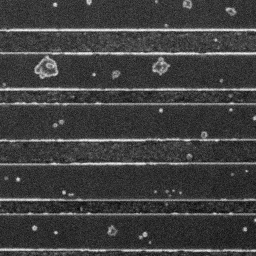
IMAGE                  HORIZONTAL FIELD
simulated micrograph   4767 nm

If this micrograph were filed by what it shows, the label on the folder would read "lines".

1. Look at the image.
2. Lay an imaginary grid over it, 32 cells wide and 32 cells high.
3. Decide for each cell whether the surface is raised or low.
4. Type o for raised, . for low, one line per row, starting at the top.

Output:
oooooooooooooooooooooooooooooooo
oooooooooooooooooooooooooooooooo
oooooooooooooooooooooooooooooooo
oooooooooooooooooooooooooooooooo
................................
................................
................................
oooooooooooooooooooooooooooooooo
oooooooooooooooooooooooooooooooo
oooooooooooooooooooooooooooooooo
oooooooooooooooooooooooooooooooo
................................
................................
oooooooooooooooooooooooooooooooo
oooooooooooooooooooooooooooooooo
oooooooooooooooooooooooooooooooo
oooooooooooooooooooooooooooooooo
ooooooooooooo.oo.......o........
................................
................................
.........ooooooooooooooooooooooo
oooooooooooooooooooooooooooooooo
oooooooooooooooooooooooooooooooo
oooooooooooooooooooooooooooooooo
oooooooooooooooooooooooooooooooo
................................
................................
oooooooooooooooooooooooooooooooo
oooooooooooooooooooooooooooooooo
oooooooooooooooooooooooooooooooo
oooooooooooooooooooooooooooooooo
................................